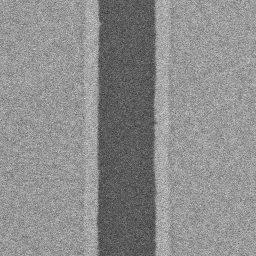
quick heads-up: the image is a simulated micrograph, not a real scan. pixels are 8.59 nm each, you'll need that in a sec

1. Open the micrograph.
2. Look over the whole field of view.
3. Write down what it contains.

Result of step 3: one or a few lines or trenches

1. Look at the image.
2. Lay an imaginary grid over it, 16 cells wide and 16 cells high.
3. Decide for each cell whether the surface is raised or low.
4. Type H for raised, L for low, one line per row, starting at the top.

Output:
HHHHHHLLLLHHHHHH
HHHHHHLLLLHHHHHH
HHHHHHLLLLHHHHHH
HHHHHHLLLLHHHHHH
HHHHHHLLLLHHHHHH
HHHHHHLLLLHHHHHH
HHHHHHLLLLHHHHHH
HHHHHHLLLLHHHHHH
HHHHHHLLLLHHHHHH
HHHHHHLLLLHHHHHH
HHHHHHLLLLHHHHHH
HHHHHHLLLLHHHHHH
HHHHHHLLLLHHHHHH
HHHHHHLLLLHHHHHH
HHHHHHLLLLHHHHHH
HHHHHHLLLLHHHHHH